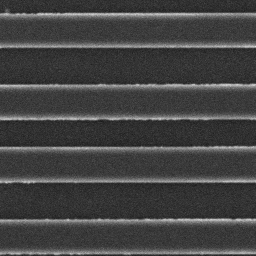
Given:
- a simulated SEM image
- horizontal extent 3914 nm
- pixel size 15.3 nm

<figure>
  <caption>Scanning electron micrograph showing lines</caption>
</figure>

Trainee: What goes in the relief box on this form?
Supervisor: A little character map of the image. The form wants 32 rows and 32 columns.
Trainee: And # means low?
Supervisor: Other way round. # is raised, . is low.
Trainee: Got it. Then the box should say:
................................
................................
################################
################################
################################
################################
................................
................................
................................
................................
................................
################################
################################
################################
################################
................................
................................
................................
################################
################################
################################
################################
################################
................................
................................
................................
................................
.....#............#.##########.#
################################
################################
################################
################################